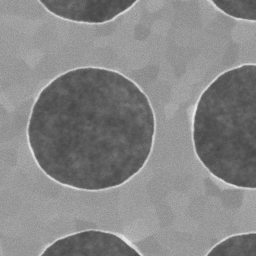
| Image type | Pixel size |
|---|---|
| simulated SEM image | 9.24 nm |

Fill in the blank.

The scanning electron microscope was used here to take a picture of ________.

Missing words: holes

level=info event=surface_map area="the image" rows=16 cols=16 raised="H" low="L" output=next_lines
HHHLLLLLHHHHHHLL
HHHHHHHHHHHHHHHH
HHHHHHHHHHHHHHHH
HHHHHHHHHHHHHHHH
HHHHLLLHHHHHHHLL
HHHLLLLLLHHHHLLL
HHLLLLLLLHHHLLLL
HHLLLLLLLLHHLLLL
HHLLLLLLLLHHLLLL
HHLLLLLLLHHHLLLL
HHHLLLLLLHHHHLLL
HHHHLLLHHHHHHHLL
HHHHHHHHHHHHHHHH
HHHHHHHHHHHHHHHH
HHHHHLHHHHHHHHHH
HHHLLLLLHHHHHLLL